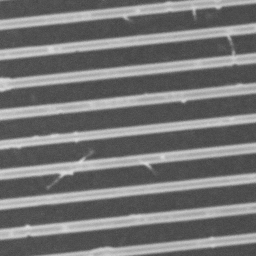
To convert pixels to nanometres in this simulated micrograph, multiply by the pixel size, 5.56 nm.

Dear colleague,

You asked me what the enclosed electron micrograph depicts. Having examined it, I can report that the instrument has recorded parallel lines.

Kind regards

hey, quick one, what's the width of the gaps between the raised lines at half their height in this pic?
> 124 nanometres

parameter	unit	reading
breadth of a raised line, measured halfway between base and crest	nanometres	42.9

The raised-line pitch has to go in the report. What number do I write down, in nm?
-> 166